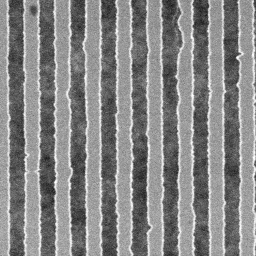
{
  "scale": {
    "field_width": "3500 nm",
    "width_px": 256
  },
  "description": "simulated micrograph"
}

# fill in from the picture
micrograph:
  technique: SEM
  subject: parallel lines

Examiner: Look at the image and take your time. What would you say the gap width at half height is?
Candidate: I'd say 217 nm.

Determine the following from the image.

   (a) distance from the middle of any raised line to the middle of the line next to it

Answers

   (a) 0.419 micrometres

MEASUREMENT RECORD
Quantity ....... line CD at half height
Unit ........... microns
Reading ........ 0.198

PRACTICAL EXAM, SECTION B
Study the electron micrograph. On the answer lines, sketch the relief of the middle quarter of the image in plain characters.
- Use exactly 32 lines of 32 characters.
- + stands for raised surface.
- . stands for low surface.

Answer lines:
+....++++....++++....+++.....+++
+.....+++....++++....+++....++++
+....++++....++++....+++....++++
+....++++....++++....+++....++++
+....++++....++++....+++.....+++
+....++++....++++....++++...++++
+....++++....++++....+++....++++
+....++++....++++....+++.....+++
+....++++....++++....+++.....+++
+.....+++....++++....++++....+++
+.....+++....++++....+++....++++
++....+++....++++....+++....++++
++....+++....++++....+++....++++
++....+++....++++....+++.....+++
+.....+++....++++....+++.....+++
+.....+++....++++....+++.....+++
++....+++....++++....+++.....+++
+.....+++....++++....++++...++++
+.....+++....++++....++++....+++
+.....+++....++++....++++....+++
+.....+++....++++....++++....+++
+.....+++....++++....++++....+++
+.....+++....++++....++++....+++
+.....+++....++++....++++....+++
+.....+++....++++....++++....+++
++....+++....++++....++++....+++
++....+++....++++....++++....+++
++....+++....++++....+++.....+++
+....++++....++++....++++....+++
+.....+++....++++....++++....+++
+.....+++....++++....++++....+++
+.....+++....++++....++++....+++